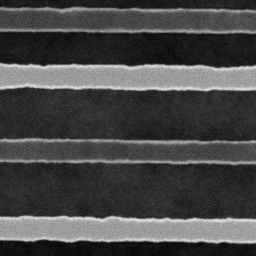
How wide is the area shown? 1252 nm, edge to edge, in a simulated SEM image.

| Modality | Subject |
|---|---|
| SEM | lines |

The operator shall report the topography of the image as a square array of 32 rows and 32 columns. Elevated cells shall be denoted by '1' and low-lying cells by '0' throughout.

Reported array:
00000000000000000000000000000000
11111111111111111111111111111111
11111111111111111111111111111111
11111111111111111111111111111111
00000000000000000000000000000000
00000000000000000000000000000000
00000000000000000000000000000000
00000000000000000000000000000000
11111111111111111111111111101111
11111111111111111111111111111111
11111111111111111111111111111111
00000000000000000000000000000000
00000000000000000000000000000000
00000000000000000000000000000000
00000000000000000000000000000000
00000000000000000000000000000000
00000000000000000000000000000000
11111111111111100000000000000000
11111111111111111111111111111111
11111111111111111111111111111111
00000000000000000000000000000100
00000000000000000000000000000000
00000000000000000000000000000000
00000000000000000000000000000000
00000000000000000000000000000000
00000000000000000000000000000000
00000000000000000000000000000000
11111111111111111111111111111111
11111111111111111111111111111111
11111111111111111111111111111111
00000000000000000000000000000000
00000000000000000000000000000000